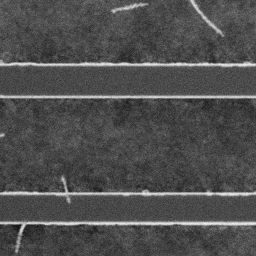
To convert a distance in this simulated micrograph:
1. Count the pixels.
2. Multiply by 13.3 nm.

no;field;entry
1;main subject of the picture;lines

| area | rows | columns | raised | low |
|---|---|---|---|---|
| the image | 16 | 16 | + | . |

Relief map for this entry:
................
................
................
................
++++++++++++++++
++++++++++++++++
................
................
................
................
................
................
++++++++++++++++
++++++++++++++++
................
................